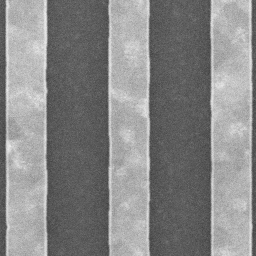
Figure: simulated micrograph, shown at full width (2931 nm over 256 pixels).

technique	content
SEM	one or a few lines or trenches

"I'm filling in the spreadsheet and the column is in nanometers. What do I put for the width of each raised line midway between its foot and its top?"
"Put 436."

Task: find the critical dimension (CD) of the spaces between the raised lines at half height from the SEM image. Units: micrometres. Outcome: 0.737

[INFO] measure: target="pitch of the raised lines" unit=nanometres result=1170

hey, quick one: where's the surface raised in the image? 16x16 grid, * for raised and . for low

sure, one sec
***....**....***
***....**....***
***....**....***
***....**....***
***....**....***
***....**....***
***....**....***
***....**....***
***....**....***
***....**....***
***....**....***
.**....**....***
***....**....***
***....**....***
.**....**....***
***....**....***